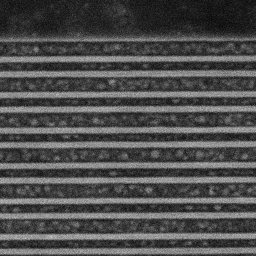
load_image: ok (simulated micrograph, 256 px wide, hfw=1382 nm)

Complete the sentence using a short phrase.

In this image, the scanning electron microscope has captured parallel lines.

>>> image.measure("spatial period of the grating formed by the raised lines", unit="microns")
0.0942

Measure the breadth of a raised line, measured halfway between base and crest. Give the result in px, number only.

5.37